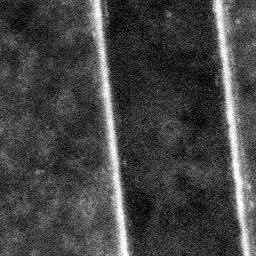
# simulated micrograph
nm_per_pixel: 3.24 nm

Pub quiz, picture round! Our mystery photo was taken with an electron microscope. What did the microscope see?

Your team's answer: one or a few lines or trenches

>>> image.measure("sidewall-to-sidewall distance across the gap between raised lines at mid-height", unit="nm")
386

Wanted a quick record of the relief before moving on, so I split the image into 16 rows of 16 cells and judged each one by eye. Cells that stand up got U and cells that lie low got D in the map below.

UUUUUUDDDDDDDDUU
UUUUUUDDDDDDDDUU
UUUUUUDDDDDDDDUU
UUUUUUDDDDDDDDUU
UUUUUUUDDDDDDDUU
UUUUUUUDDDDDDDUU
UUUUUUUDDDDDDDUU
UUUUUUUDDDDDDDUU
UUUUUUUDDDDDDDDU
UUUUUUUDDDDDDDDU
UUUUUUUDDDDDDDDU
UUUUUUUDDDDDDDDU
UUUUUUUDDDDDDDDU
UUUUUUUUDDDDDDDU
UUUUUUUUDDDDDDDU
UUUUUUUUDDDDDDDU